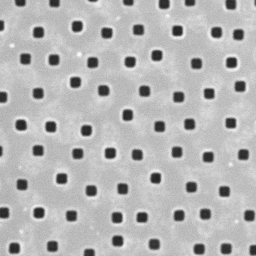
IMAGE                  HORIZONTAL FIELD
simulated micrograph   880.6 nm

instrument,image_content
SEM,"a regular array of holes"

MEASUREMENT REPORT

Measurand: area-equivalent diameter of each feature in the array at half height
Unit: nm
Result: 41.5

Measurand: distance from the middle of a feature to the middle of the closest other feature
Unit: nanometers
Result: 101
